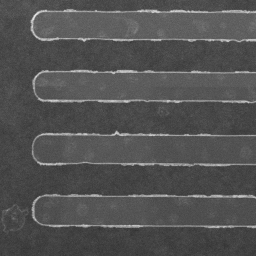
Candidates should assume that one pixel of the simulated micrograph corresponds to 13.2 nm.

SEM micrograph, one or a few lines or trenches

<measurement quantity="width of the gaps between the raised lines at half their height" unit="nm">377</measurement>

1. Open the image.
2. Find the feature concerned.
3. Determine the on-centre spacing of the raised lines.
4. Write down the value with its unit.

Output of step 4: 0.819 microns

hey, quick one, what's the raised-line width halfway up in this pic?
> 0.438 microns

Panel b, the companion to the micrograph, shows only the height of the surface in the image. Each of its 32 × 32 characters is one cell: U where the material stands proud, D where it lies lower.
UUUUUUUUUUUUUUUUUUUUUUUUUUUUUUUU
UUUUUDDDDDDDDUDDDDDUDDDUUUUUUUUU
UUUUDDDDDDDDDDDDDDDDDDDDDDDDDDDD
UUUUDDDDDDDDDDDDUDDDDDDDDDDDDDDD
UUUUUDDDDDDDDDDDDDDDDDDDDDDDDDDD
UUUUUUUUUUUUUUUUUUUUUUUUUUUUUUUU
UUUUUUUUUUUUUUUUUUUUUUUUUUUUUUUU
UUUUUUUUUUUUUUUUUUUUUUUUUUUUUUUU
UUUUUUUUUUUUUUUUUUUUUUUUUUUUUUUU
UUUUUDDDDDDDDDDDDDDDDDDDDDDDDDDD
UUUUDDDDDDDDDDDDDDDDDDDDDDDDDDDD
UUUUDDDDDDDDDDDDDDDDDDDDDDDDDDDD
UUUUUUDDDDDDDDDDDDDDDDDDDDDDDDDD
UUUUUUUUUUUUUUUUUUUUUUUUUUUUUUUU
UUUUUUUUUUUUUUUUUUUUUUUUUUUUUUUU
UUUUUUUUUUUUUUUUUUUUUUUUUUUUUUUU
UUUUUUUUUUUUUUUUUUUUUUUUUUUUUUUU
UUUUDDDDDDDDDDDDDDDDDDDDDDDDDDDD
UUUUDDDDDDDDDDDDDDDDDDDDDDDDDDDD
UUUUDDDDDDDDDDDDDDDDDDDDDDDDDDDD
UUUUUUUUUUUUUUUUUUUUUUUDUUDDDDDD
UUUUUUUUUUUUUUUUUUUUUUUUUUUUUUUU
UUUUUUUUUUUUUUUUUUUUUUUUUUUUUUUU
UUUUUUUUUUUUUUUUUUUUUUUUUUUUUUUU
UUUUUUDDUUDUUUUDUDUUUUUUUUUUUUUU
UUUUDDDDDDDDDDDDDDDDDDDDDDDDDDDD
UUUUDDDDDDDDDDDDDDDDDDDDDDDDDDDD
UUUUUDDDDDDDDDDDDDDDDDDDDDDDDDDD
UUUUUUUUUUUUUUUUUUUUUUUUUUUUUUUU
UUUUUUUUUUUUUUUUUUUUUUUUUUUUUUUU
UUUUUUUUUUUUUUUUUUUUUUUUUUUUUUUU
UUUUUUUUUUUUUUUUUUUUUUUUUUUUUUUU